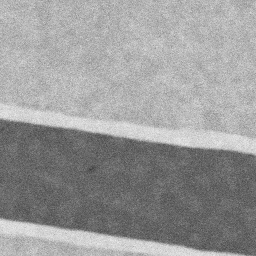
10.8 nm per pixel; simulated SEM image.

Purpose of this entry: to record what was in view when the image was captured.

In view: one or a few lines or trenches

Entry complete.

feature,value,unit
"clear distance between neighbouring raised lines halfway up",1240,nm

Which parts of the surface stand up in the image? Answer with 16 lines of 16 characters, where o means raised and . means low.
oooooooooooooooo
oooooooooooooooo
oooooooooooooooo
oooooooooooooooo
oooooooooooooooo
oooooooooooooooo
oooooooooooooooo
....oooooooooooo
...........ooooo
................
................
................
................
................
oo..............
ooooooooo.......